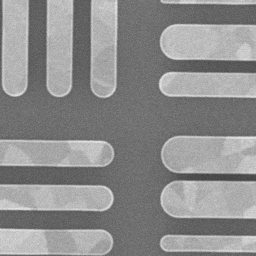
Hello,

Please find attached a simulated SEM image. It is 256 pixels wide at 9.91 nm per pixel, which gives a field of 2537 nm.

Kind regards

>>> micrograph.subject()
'groups of lines, slits or small figures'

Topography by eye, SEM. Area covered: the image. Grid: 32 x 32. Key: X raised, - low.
XXX---XXX---XXX-----------------
XXX---XXX---XXX-----------------
XXX---XXX---XXX-----------------
XXX---XXX---XXX------XXXXXXXXXXX
XXX---XXX---XXX-----XXXXXXXXXXXX
XXX---XXX---XX------XXXXXXXXXXXX
XXX---XXX---XX------XXXXXXXXXXXX
XXX---XXX---XX------------------
XXX---XXX---XX------------------
XXX---XXX--XXX------XXXXXXXXXXXX
XXX---XXX--XXX------XXXXXXXXXXXX
-XX---XX----XX------XXXXXXXXXXXX
--------------------------------
--------------------------------
--------------------------------
--------------------------------
--------------------------------
---------------------XXXXXXXXXXX
XXXXXXXXXXXXXX------XXXXXXXXXXXX
XXXXXXXXXXXXXX------XXXXXXXXXXXX
XXXXXXXXXXXXX--------XXXXXXXXXXX
----------------------XXXXXXXXXX
--------------------------------
XXXXXXXXXXXXX--------XXXXXXXXXXX
XXXXXXXXXXXXXX------XXXXXXXXXXXX
XXXXXXXXXXXXXX------XXXXXXXXXXXX
---------------------XXXXXXXXXXX
--------------------------------
--------------------------------
XXXXXXXXXXXXXX-------XX---------
XXXXXXXXXXXXXX------XXXXXXXXXXXX
XXXXXXXXXXXXX-------------------